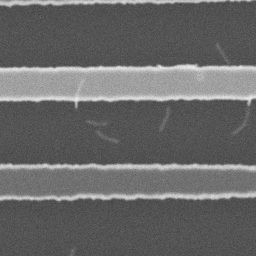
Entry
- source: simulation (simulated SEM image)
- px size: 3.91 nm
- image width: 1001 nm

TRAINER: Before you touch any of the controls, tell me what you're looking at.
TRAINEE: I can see lines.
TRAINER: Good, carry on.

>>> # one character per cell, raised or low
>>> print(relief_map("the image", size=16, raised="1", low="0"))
0000000000000000
0000000000000000
0000000000000000
0000000000000000
1111111111111111
1111111111111111
0000000000000000
0000000000000000
0000000000000000
0000000000000000
1111111111111111
1111111111111111
0011000000000000
0000000000000000
0000000000000000
0000000000000000